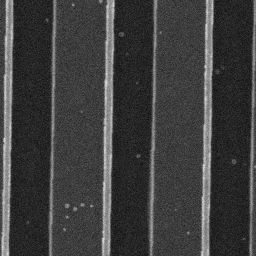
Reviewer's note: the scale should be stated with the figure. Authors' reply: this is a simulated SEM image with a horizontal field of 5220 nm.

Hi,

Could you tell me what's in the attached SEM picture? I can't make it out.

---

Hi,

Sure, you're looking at lines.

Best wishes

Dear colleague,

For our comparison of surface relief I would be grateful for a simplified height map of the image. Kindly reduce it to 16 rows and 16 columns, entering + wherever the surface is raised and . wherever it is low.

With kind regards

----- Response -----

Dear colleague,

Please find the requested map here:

+..++++...+++...
+..++++...+++...
+..++++...+++...
+..++++...+++...
+..++++...+++...
+..++++...+++...
+..++++...+++...
+..++++...+++...
+..++++...+++...
+..++++...+++...
+..++++...+++...
+..++++...+++...
+..++++...+++...
+..++++...+++...
+..++++..++++...
+..++++..++++...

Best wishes